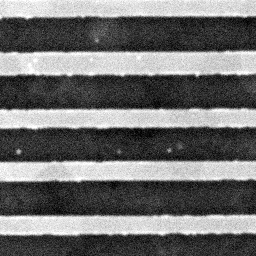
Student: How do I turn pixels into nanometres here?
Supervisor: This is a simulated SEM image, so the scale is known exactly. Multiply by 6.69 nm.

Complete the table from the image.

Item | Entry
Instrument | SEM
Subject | lines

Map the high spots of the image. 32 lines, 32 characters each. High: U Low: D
UUUUUUUUUUUUUUUUUUUUUUUUUUUUUUUU
UUUUUUUUUUUUUUUUUUUUUUUUUUUUUUUU
DDDDDDDDDDDDDDDDDDDDDDDDDDDDDDDD
DDDDDDDDDDDDDDDDDDDDDDDDDDDDDDDD
DDDDDDDDDDDDDDDDDDDDDDDDDDDDDDDD
DDDDDDDDDDDDDDDDDDDDDDDDDDDDDDDD
DDDDDDDDDDDDDDDDDDDDDDDDDDDDDDDD
UUUUUUUUUUUUUUUUUUUUUUUUUUUUUUUU
UUUUUUUUUUUUUUUUUUUUUUUUUUUUUUUU
DDDDDDDDDDDDDDDDDDDDDDDDDDDDDDDD
DDDDDDDDDDDDDDDDDDDDDDDDDDDDDDDD
DDDDDDDDDDDDDDDDDDDDDDDDDDDDDDDD
DDDDDDDDDDDDDDDDDDDDDDDDDDDDDDDD
DDDDDDDDDDDDDDDDDDDDDDDDDDDDDDDD
UUUUUUUUUUUUUUUUUUUUUUUUUUUUUUUU
UUUUUUUUUUUUUUUUUUUUUUUUUUUUUUUU
DDDDDDDDDDDDDDDDDDDDDDDDDDDDDDDD
DDDDDDDDDDDDDDDDDDDDDDDDDDDDDDDD
DDDDDDDDDDDDDDDDDDDDDDDDDDDDDDDD
DDDDDDDDDDDDDDDDDDDDDDDDDDDDDDDD
UUUUUUUUUUUUUUUUUUUUUUUUUUUUUUUU
UUUUUUUUUUUUUUUUUUUUUUUUUUUUUUUU
UUUUUUUUUUDDDDDDDDDDDDDDDDDDDDDD
DDDDDDDDDDDDDDDDDDDDDDDDDDDDDDDD
DDDDDDDDDDDDDDDDDDDDDDDDDDDDDDDD
DDDDDDDDDDDDDDDDDDDDDDDDDDDDDDDD
DDDDDDDDDDDDDDDDDDDDDDDDDDDDDDDD
UUUUUUUUUUUUUUUUUUUUUUUUUUUUUUUU
UUUUUUUUUUUUUUUUUUUUUUUUUUUUUUUU
DDDDDDDDDDDDDDDDDDDDDDDDDDDDDDDD
DDDDDDDDDDDDDDDDDDDDDDDDDDDDDDDD
DDDDDDDDDDDDDDDDDDDDDDDDDDDDDDDD